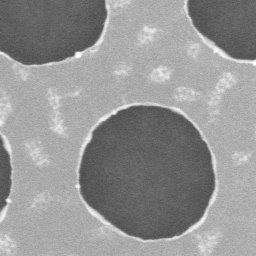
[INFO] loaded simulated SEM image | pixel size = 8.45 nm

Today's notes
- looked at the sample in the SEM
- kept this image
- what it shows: holes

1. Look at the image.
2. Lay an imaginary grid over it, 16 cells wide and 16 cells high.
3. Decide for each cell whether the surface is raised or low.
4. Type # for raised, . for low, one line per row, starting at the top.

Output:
.......#####....
.......#####....
......#######...
....##########..
################
################
################
#######.....####
######.......###
.####........###
.####........###
.####........###
#####........###
######.......###
########....####
################